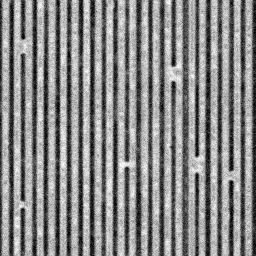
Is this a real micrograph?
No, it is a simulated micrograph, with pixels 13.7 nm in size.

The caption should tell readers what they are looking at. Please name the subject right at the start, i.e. parallel lines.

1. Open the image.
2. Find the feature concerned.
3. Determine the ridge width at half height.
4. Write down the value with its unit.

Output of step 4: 76.8 nm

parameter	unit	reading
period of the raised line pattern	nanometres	158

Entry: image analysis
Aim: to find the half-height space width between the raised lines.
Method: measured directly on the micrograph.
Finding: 75.1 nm